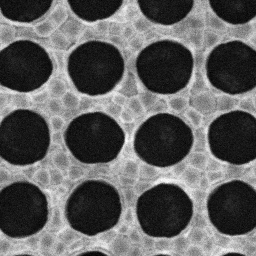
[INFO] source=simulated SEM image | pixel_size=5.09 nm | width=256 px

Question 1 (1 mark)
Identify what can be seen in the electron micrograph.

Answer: holes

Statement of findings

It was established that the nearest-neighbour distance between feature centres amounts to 352 nanometres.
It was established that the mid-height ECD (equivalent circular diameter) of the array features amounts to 284 nanometers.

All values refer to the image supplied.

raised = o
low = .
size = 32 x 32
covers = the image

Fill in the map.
......ooo......oo.......oo......
......ooo.....oooo......ooo.....
o....ooooo..ooooooo....ooooo...o
oooooooooooooooooooooooooooooooo
oooooooooooooooooooooooooooooooo
o....ooooo....ooooo...oooooo...o
......ooo......ooo......oo......
......ooo......oo.......oo......
.......o........o.......oo......
......ooo......oo.......oo......
......ooo......ooo.....ooo......
oo..oooooo....ooooo...oooooo...o
oooooooooooooooooooooooooooooooo
oooooooooooooooooooooooooooooooo
o....ooooo....ooooo...ooooo.....
......ooo......ooo.....ooo......
......oo.......oo.......oo......
......oo........o.......oo......
......ooo......oo.......oo......
......ooo......oo......oooo.....
o...ooooooo.ooooooo...ooooooo..o
oooooooooooooooooooooooooooooooo
ooooooooooooooooooooooooooooo.oo
o....oooo.....ooooo....oooo.....
......ooo......oo.......oo......
......oo.......oo.......oo......
......oo.......oo.......oo......
......oo.......oo.......oo......
.....oooo.....oooo.....oooo.....
o...ooooooooooooooo...oooooooooo
oooooooooooooooooooooooooooooooo
ooooooooooo..ooooooooooooooooooo